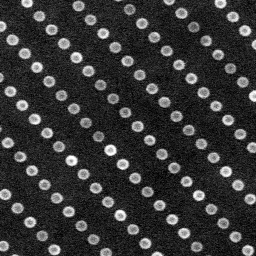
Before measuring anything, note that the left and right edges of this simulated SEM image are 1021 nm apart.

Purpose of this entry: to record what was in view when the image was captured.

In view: a regular array of raised bodies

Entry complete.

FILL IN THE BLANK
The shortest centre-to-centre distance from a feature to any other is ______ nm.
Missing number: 73.1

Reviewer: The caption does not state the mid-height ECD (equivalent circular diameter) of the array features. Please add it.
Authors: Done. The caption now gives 0.0408 micrometres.